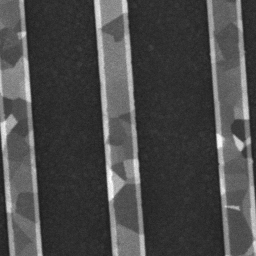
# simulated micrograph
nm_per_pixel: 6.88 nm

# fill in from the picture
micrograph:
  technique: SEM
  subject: one or a few lines or trenches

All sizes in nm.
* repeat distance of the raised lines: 750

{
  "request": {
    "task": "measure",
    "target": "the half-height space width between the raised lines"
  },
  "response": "0.549 µm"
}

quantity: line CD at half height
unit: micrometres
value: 0.193